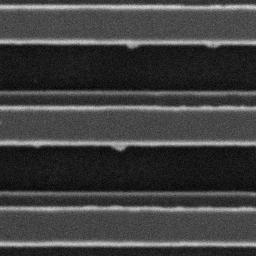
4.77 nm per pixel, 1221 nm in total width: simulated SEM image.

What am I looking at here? lines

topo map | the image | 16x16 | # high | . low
################
################
################
................
................
................
................
################
################
................
................
................
................
################
################
................